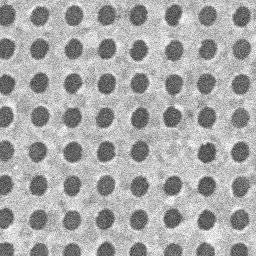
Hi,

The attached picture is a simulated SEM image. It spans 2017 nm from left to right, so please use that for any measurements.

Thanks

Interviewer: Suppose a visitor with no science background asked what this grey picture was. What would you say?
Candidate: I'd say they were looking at a regular array of holes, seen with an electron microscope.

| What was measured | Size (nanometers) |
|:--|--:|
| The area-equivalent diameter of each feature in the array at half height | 162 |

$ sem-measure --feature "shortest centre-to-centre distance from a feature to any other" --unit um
0.26